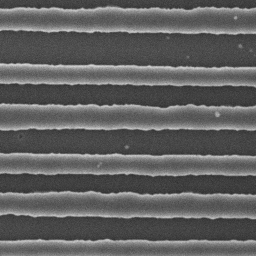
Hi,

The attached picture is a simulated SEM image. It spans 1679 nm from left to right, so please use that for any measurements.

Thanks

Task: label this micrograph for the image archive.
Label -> lines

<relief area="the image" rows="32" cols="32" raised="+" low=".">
................................
++++++++++++++++++++++++++++++++
++++++++++++++++++++++++++++++++
++++++++++++++++++++++++++++++++
................................
................................
................................
................................
++++++++++++++++++++++++++++++++
++++++++++++++++++++++++++++++++
..............++++++++++++++++++
................................
................................
++++++++++++++++++++.+++++++++++
++++++++++++++++++++++++++++++++
++++++++++++++++++++++++++++++++
................................
................................
................................
+++++++++++++++++++.+++++++..+..
++++++++++++++++++++++++++++++++
++++++++++++++++++++++++++++++++
................................
................................
++++++++++++++++++++++++++++++++
++++++++++++++++++++++++++++++++
++++++++++++++++++++++++++++++++
................................
................................
................................
++++++++++++++++++++++++++++++++
++++++++++++++++++++++++++++++++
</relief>